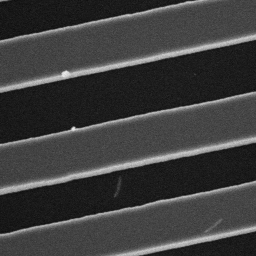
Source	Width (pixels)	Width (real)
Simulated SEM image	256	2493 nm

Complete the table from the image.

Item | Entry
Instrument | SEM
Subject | lines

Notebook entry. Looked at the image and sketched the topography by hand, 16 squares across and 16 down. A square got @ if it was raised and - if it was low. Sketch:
----------@@@@@@
-----@@@@@@@@@@@
@@@@@@@@@@@@@@@-
@@@@@@@@@@@-----
@@@@@@----------
@---------------
------------@@@@
-------@@@@@@@@@
---@@@@@@@@@@@@@
@@@@@@@@@@@@----
@@@@@@@@--------
@@@------------@
----------@@@@@@
-----@@@@@@@@@@@
-@@@@@@@@@@@@@@-
@@@@@@@@@@------